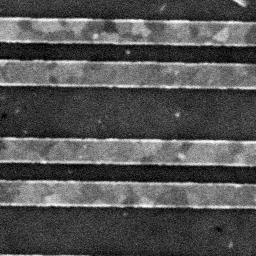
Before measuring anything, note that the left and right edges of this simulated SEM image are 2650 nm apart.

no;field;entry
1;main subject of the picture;lines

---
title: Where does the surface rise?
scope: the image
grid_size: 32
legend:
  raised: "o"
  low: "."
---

................................
................................
oooooooooooo....................
oooooooooooooooooooooooooooooooo
oooooooooooooooooooooooooooooooo
.....................ooooooooooo
................................
................................
oooooooooooooooooooooooooooooooo
oooooooooooooooooooooooooooooooo
oooooooooooooooooooooooooooooooo
................................
................................
................................
................................
................................
................................
oooooooooooo.o..................
oooooooooooooooooooooooooooooooo
oooooooooooooooooooooooooooooooo
.....................ooooooooooo
................................
................................
oooooooooooooooooooooooooooooooo
oooooooooooooooooooooooooooooooo
oooooooooooooooooooooooooooooooo
................................
................................
................................
................................
................................
................................